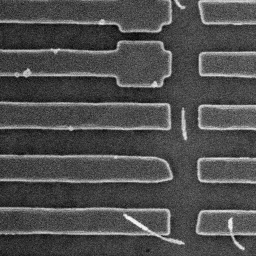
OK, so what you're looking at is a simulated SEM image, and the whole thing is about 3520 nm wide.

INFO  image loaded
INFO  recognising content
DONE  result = wiring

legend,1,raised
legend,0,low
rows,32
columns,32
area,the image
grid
11111111111111111111100001111111
11111111111111111111100001111111
11111111111111111111100001111111
00000000000000011111000000000000
00000000000000000000000000000000
00000000000000011111000000000000
11111111111111111111100000000000
11111111111111111111100001111111
11111111111111111111100001111111
00110000000011111111100000001111
00000000000000011111000000000000
00000000000000000000000000000000
00000000000000000000000000000000
11111111111111111111100001111111
11111111111111111111100001111111
11111111111111111111100001111111
00000000000000000000000000000000
00000000000000000000000000000000
00000000000000000000000000000000
11111111111111100000000000000000
11111111111111111111100001111111
11111111111111111111100001111111
11111111111111111111100001111111
00000000000000000000000000000000
00000000000000000000000000000000
00000000000000000000000000000000
11111111111111111111100001111111
11111111111111111111100001111111
11111111111111111111100001111111
00000000000000000000000000000000
00000000000000000000000000000000
00000000000000000000000000000000